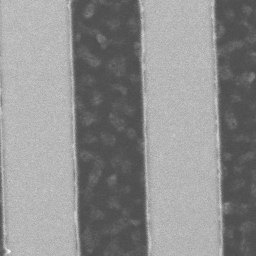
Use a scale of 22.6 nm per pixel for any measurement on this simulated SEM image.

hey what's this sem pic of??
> one or a few lines or trenches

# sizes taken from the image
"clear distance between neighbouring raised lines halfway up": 1620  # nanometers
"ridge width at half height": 1620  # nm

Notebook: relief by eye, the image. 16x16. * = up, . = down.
....*****....***
....*****....***
....*****....***
....*****....***
....*****.....**
.....****.....**
.....****.....**
.....****.....**
.....****.....**
.....****.....**
.....****.....**
.....****.....**
.....****.....**
.....****.....**
.....****.....**
.....****.....**